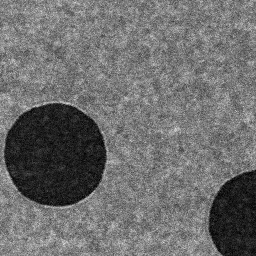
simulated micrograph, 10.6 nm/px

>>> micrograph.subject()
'holes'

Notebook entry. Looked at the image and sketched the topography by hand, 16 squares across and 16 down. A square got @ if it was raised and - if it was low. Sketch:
@@@@@@@@@@@@@@@@
@@@@@@@@@@@@@@@@
@@@@@@@@@@@@@@@@
@@@@@@@@@@@@@@@@
@@@@@@@@@@@@@@@@
@@@@@@@@@@@@@@@@
@@@-@@@@@@@@@@@@
@-----@@@@@@@@@@
------@@@@@@@@@@
-------@@@@@@@@@
-------@@@@@@@@@
@-----@@@@@@@@--
@@---@@@@@@@@---
@@@@@@@@@@@@@---
@@@@@@@@@@@@@---
@@@@@@@@@@@@@---